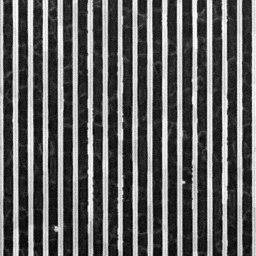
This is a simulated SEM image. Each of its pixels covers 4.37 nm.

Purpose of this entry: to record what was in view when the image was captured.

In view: parallel lines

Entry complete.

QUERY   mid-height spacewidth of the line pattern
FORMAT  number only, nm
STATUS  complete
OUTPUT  52.4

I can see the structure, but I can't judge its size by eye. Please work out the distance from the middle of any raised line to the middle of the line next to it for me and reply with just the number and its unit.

65.2 nm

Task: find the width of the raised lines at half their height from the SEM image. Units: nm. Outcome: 14.7